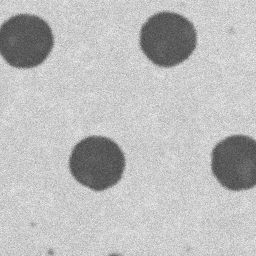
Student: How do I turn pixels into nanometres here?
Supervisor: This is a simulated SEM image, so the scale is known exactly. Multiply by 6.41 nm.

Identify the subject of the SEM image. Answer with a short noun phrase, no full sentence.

holes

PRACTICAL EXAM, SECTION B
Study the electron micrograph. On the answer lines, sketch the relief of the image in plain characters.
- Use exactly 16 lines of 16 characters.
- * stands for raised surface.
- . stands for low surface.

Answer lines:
****************
...******...****
...******...****
...******...****
****************
****************
****************
****************
****************
****....*****...
****....*****...
*****..*******..
****************
****************
****************
****************